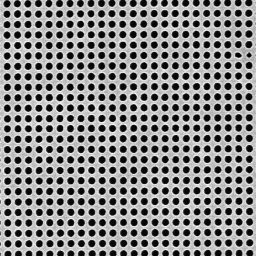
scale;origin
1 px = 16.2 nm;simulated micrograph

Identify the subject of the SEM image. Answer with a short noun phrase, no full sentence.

a regular array of holes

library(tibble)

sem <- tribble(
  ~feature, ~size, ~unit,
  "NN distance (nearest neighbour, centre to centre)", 166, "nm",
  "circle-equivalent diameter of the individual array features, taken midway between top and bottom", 121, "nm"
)